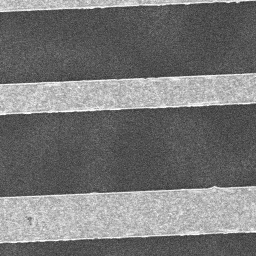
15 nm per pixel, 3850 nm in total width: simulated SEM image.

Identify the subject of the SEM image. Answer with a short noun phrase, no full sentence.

one or a few lines or trenches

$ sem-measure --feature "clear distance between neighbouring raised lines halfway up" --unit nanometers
1170